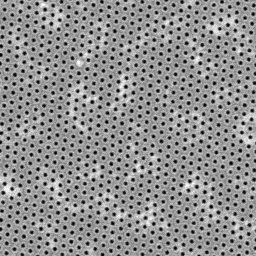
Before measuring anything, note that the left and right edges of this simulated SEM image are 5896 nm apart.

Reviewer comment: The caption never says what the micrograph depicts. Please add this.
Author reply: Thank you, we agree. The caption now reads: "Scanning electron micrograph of a regular array of holes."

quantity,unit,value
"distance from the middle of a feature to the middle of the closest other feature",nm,201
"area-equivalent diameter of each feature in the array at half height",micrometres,0.0972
